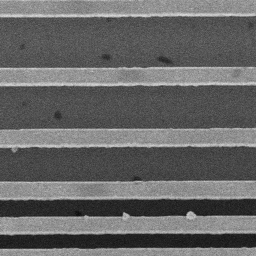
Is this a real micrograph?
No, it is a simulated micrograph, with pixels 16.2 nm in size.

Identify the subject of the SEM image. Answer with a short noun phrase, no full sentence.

lines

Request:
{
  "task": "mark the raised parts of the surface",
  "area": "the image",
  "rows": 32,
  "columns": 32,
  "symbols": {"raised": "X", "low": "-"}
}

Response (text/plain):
XXXXXXXXXXXXXXXXXXXXXXXXXXXXXXXX
XXXXXXXXXXXXXXXXXXXXXXXXXXXXXXXX
--------------------------------
--------------------------------
--------------------------------
--------------------------------
--------------------------------
--------------------------------
---------------XXXXXXXXXXXXXXXXX
XXXXXXXXXXXXXXXXXXXXXXXXXXXXXXXX
XXXXXXXXXXXXXXXXXXXXXXXXXXXXXXXX
--------------------------------
--------------------------------
--------------------------------
--------------------------------
--------------------------------
XXXXXXXXXXXXXXXXXXXXXXXXXXXXXXXX
XXXXXXXXXXXXXXXXXXXXXXXXXXXXXXXX
--------------------------------
--------------------------------
--------------------------------
--------------------------------
--------------------------------
XXXXXXXXXXXXXXXXXXXXXXXXXXXXXXXX
XXXXXXXXXXXXXXXXXXXXXXXXXXXXXXXX
--------------------------------
--------------------------------
XXXXXXXXXXXXXXXXXXXXXXXXXXXXXXXX
XXXXXXXXXXXXXXXXXXXXXXXXXXXXXXXX
--------------------------------
--------------------------------
XXXXXXXXXXXXXXXXXXXXXXXXXXXXXXXX